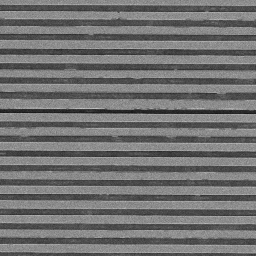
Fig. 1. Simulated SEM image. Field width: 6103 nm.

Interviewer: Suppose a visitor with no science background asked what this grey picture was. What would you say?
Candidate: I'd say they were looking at parallel lines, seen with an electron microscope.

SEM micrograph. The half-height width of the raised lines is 188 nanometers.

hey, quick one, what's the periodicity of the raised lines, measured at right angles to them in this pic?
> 348 nm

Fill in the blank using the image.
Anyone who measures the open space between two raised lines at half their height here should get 6.12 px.